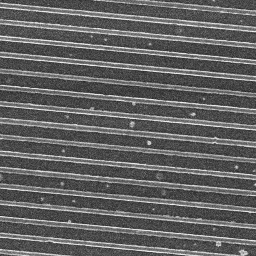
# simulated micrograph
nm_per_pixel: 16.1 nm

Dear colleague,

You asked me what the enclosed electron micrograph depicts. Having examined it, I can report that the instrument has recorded parallel lines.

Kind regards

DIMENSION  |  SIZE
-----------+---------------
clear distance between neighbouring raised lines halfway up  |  189 nm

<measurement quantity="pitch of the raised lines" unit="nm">264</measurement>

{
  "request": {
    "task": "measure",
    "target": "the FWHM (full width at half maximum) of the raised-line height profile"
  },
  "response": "64.2 nm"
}